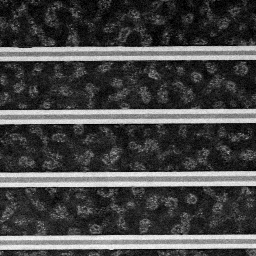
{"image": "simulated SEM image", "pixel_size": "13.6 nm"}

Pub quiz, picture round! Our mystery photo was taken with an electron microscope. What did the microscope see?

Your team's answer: one or a few lines or trenches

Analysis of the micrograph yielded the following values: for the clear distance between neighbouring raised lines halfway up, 0.733 micrometres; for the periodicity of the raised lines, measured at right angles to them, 0.857 um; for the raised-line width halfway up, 128 nanometers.